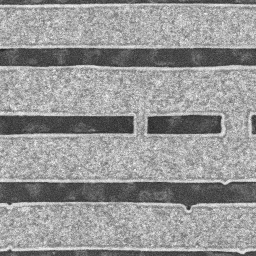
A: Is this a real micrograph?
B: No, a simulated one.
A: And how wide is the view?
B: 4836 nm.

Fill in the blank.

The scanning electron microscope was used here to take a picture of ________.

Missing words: one or a few lines or trenches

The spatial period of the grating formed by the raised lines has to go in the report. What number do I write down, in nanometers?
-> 1260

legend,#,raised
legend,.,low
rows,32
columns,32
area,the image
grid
................................
################################
################################
################################
################################
################################
................................
................................
.......#######..................
################################
################################
################################
################################
################################
.................##.........###.
.................#..........###.
.................#..........###.
################################
################################
################################
################################
################################
....#######.###################.
................................
................................
......###########...............
################################
################################
################################
################################
################################
................................